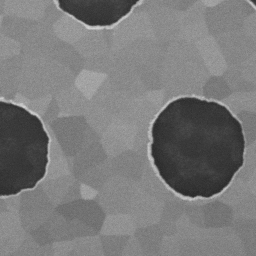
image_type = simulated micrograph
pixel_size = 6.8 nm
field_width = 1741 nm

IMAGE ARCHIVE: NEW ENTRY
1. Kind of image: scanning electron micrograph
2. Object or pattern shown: holes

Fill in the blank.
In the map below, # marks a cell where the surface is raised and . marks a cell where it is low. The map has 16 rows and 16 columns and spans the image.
####....########
#####..#########
################
################
################
################
.##########...##
..########.....#
...#######.....#
...######......#
...#######.....#
..########....##
################
################
################
################